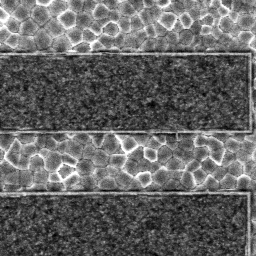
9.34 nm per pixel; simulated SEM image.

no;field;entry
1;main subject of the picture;one or a few lines or trenches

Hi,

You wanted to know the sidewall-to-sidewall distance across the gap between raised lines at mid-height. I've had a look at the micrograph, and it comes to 0.566 um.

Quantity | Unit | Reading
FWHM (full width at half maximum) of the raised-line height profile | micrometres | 0.73